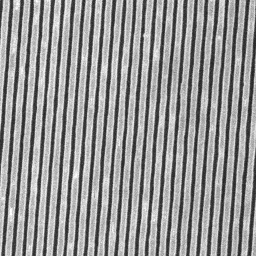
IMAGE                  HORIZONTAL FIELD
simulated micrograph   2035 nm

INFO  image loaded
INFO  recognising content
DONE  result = parallel lines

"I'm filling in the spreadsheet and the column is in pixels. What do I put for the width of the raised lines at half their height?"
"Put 6.1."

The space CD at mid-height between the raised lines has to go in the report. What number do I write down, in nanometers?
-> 34.7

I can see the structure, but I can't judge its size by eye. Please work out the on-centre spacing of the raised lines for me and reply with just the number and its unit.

10.2 px